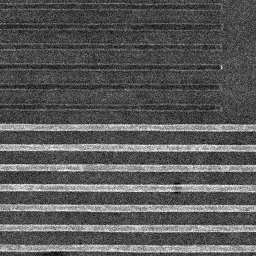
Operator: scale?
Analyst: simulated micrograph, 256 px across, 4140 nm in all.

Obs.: parallel lines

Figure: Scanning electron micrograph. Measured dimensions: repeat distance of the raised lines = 326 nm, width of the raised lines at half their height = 84.9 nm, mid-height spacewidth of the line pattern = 238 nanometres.